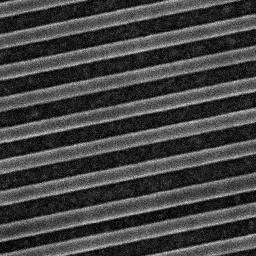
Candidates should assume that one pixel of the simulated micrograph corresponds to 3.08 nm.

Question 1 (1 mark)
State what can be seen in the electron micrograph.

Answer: parallel lines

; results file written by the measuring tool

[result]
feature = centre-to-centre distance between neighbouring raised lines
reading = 95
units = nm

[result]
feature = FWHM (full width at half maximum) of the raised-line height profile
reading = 13.1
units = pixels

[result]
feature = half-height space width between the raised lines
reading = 53.9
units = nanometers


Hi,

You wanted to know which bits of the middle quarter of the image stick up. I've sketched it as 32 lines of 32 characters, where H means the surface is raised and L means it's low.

HLLLLLLLLLLLLLLLLLLLLLLLHHHHHHHH
LLLLLLLLLLLLLLLLLLLHHHHHHHHHHHHH
LLLLLLLLLLLLLLHHHHHHHHHHHHHHHHLL
LLLLLLLLHHHHHHHHHHHHHHHHHLLLLLLL
LLLLHHHHHHHHHHHHHHHHLLLLLLLLLLLL
HHHHHHHHHHHHHHHLLLLLLLLLLLLLLLLL
HHHHHHHHHHLLLLLLLLLLLLLLLLLLLLLL
HHHHHLLLLLLLLLLLLLLLLLLLLLLLHHHH
LLLLLLLLLLLLLLLLLLLLLLLHHHHHHHHH
LLLLLLLLLLLLLLLLLLHHHHHHHHHHHHHH
LLLLLLLLLLLLLHHHHHHHHHHHHHHHHLLL
LLLLLLLLHHHHHHHHHHHHHHHHHLLLLLLL
LLLHHHHHHHHHHHHHHHHLLLLLLLLLLLLL
HHHHHHHHHHHHHHHLLLLLLLLLLLLLLLLL
HHHHHHHHHHLLLLLLLLLLLLLLLLLLLLLH
HHHHLLLLLLLLLLLLLLLLLLLLLLLHHHHH
LLLLLLLLLLLLLLLLLLLLLLHHHHHHHHHH
LLLLLLLLLLLLLLLLLHHHHHHHHHHHHHHH
LLLLLLLLLLLLHHHHHHHHHHHHHHHHLLLL
LLLLLLLHHHHHHHHHHHHHHHHLLLLLLLLL
LLHHHHHHHHHHHHHHHHLLLLLLLLLLLLLL
HHHHHHHHHHHHHHLLLLLLLLLLLLLLLLLL
HHHHHHHHLLLLLLLLLLLLLLLLLLLLLLHH
HHHLLLLLLLLLLLLLLLLLLLLLLLHHHHHH
LLLLLLLLLLLLLLLLLLLLLHHHHHHHHHHH
LLLLLLLLLLLLLLLLHHHHHHHHHHHHHHHH
LLLLLLLLLLLHHHHHHHHHHHHHHHHHLLLL
LLLLLLHHHHHHHHHHHHHHHHHLLLLLLLLL
LHHHHHHHHHHHHHHHHLLLLLLLLLLLLLLL
HHHHHHHHHHHHHLLLLLLLLLLLLLLLLLLL
HHHHHHHHLLLLLLLLLLLLLLLLLLLLLLLL
HHHLLLLLLLLLLLLLLLLLLLLLLLLHHHHH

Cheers